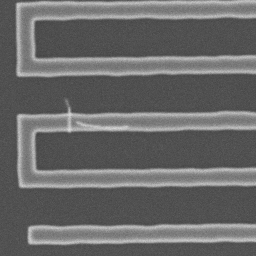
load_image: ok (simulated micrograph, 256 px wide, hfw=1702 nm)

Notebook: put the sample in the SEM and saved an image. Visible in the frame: groups of lines, slits or small figures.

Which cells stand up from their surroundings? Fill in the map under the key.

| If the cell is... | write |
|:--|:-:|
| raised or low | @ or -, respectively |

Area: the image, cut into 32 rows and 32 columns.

--@@@@@@@@@@@@@@@@@@@@@@@@@@@@@@
--@@@@@@@@@@@@@@@@@@@@@@@@@@@@@@
--@@@---------------------------
--@@----------------------------
--@@----------------------------
--@@----------------------------
--@@----------------------------
--@@@@@@@@@@@@@@@@@@@@@@@@@@@@@@
--@@@@@@@@@@@@@@@@@@@@@@@@@@@@@@
--------------------------------
--------------------------------
--------------------------------
--------------------------------
--------------------------------
--@@@@@@@@@@@@@@@@@@@@@@@@@@@@@@
--@@@@@@@@@@@@@@@@@@@@@@@@@@@@@@
--@@@---------------------------
--@@----------------------------
--@@----------------------------
--@@----------------------------
--@@----------------------------
--@@@@@@@@@@@@@@@@@@@@@@@@@@@@@@
--@@@@@@@@@@@@@@@@@@@@@@@@@@@@@@
--------------------------------
--------------------------------
--------------------------------
--------------------------------
--------------------------------
----@@@@@@@@@@@@@@@@@@@@@@@@@@@@
----@@@@@@@@@@@@@@@@@@@@@@@@@@@@
--------------------------------
--------------------------------